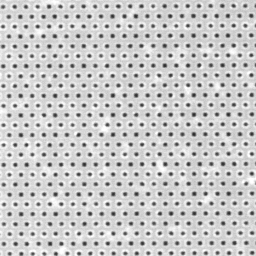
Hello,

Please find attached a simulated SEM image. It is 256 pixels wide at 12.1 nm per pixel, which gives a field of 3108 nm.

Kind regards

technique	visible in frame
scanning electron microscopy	a regular array of holes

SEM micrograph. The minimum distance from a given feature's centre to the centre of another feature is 134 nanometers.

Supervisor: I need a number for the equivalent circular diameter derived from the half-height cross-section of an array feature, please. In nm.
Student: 61.3